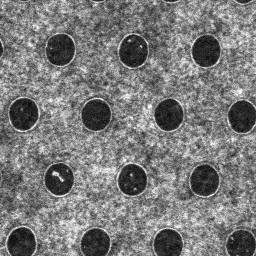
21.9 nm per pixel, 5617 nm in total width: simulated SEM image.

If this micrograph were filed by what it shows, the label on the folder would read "a regular array of raised bodies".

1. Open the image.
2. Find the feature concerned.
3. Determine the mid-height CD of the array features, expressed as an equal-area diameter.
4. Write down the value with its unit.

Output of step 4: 708 nanometers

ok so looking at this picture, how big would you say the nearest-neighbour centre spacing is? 1590 nanometers